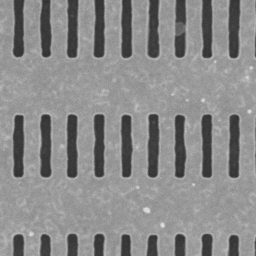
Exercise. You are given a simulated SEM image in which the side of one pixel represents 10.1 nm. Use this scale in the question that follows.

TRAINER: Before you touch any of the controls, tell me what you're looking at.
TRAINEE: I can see a regular array of holes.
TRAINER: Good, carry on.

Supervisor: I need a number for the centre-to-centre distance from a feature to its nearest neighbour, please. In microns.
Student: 0.272